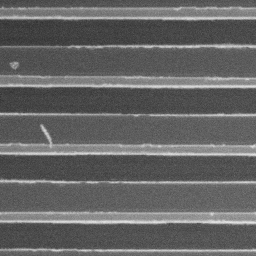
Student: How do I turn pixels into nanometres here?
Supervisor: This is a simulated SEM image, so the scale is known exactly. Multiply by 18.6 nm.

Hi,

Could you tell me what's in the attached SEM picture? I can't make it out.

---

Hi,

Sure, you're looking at lines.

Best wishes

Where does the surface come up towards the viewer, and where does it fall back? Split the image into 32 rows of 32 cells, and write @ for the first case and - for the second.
@@@@@@@@@@@@@@@@@@@@@@@@@@@@@@@@
@@@@@@@@@@@@@@@@@@@@@@@@@@@@@@@@
--------------------------------
--------------------------------
--------------------------------
--------------------------------
@@@@@@@@@@@@@@@@@@@@@@@@@@@@@@@@
@@@@@@@@@@@@@@@@@@@@@@@@@@@@@@@@
@@@@@@@@@@@@@@@@@@@@@@@@@@@@@@@@
@@@@@@@@@@@@@@@@@@@@@@@@@@@@@@@@
@@@@@@@@@@@@@@@@@@@@@@@@@@@@@@@@
--------------------------------
--------------------------------
--------------------------------
@@@@@@@@@@@@@@@@@@@-@@----------
@@@@@@@@@@@@@@@@@@@@@@@@@@@@@@@@
@@@@@@@@@@@@@@@@@@@@@@@@@@@@@@@@
@@@@@@@@@@@@@@@@@@@@@@@@@@@@@@@@
@@@@@@@@@@@@@@@@@@@@@@@@@@@@@@@@
--------------------------------
--------------------------------
--------------------------------
--------------------------------
@@@@@@@@@@@@@@@@@@@@@@@@@@@@@@@@
@@@@@@@@@@@@@@@@@@@@@@@@@@@@@@@@
@@@@@@@@@@@@@@@@@@@@@@@@@@@@@@@@
@@@@@@@@@@@@@@@@@@@@@@@@@@@@@@@@
@@@@@@@@@@@@@@@@@@@@@@@@@@@@@@@@
--------------------------------
--------------------------------
--------------------------------
@@@@@@@@@@@@@@@@@@@@@@@@@@@@@@@@